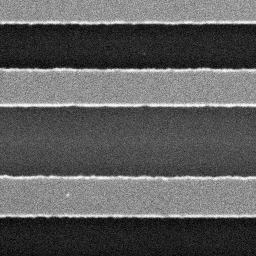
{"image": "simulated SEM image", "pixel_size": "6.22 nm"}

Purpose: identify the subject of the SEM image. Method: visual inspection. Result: lines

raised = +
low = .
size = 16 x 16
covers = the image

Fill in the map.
++++++++++++++++
................
................
................
++++++++++++++++
++++++++++++++++
++++++++++++++++
................
................
................
................
++++++++++++++++
++++++++++++++++
++++++++++++++++
................
................